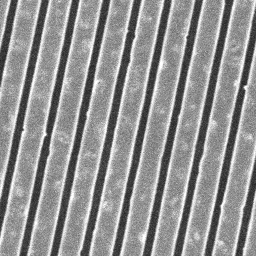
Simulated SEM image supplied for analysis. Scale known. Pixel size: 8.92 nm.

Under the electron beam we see parallel lines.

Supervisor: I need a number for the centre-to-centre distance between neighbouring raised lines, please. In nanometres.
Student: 269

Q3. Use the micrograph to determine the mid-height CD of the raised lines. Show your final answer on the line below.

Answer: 21.3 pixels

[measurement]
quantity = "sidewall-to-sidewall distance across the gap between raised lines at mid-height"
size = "77.6 nanometers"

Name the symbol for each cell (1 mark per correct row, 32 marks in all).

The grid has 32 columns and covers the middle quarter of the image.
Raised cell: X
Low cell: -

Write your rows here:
-XXXXX--XXXXXX--XXXXX---XXXXX--X
XXXXXX--XXXXXX--XXXXX---XXXXX--X
XXXXXX--XXXXX---XXXXX--XXXXXX--X
XXXXX---XXXXX--XXXXXX--XXXXXX--X
XXXXX---XXXXX--XXXXXX--XXXXX---X
XXXXX--XXXXXX--XXXXXX--XXXXX--XX
XXXXX--XXXXXX--XXXXX---XXXXX--XX
XXXXX--XXXXX---XXXXX---XXXXX--XX
XXXX---XXXXX--XXXXXX--XXXXXX--XX
XXXX---XXXXX--XXXXXX--XXXXX---XX
XXXX--XXXXXX--XXXXXX--XXXXX---XX
XXXX--XXXXX---XXXXX--XXXXXX--XXX
XXXX--XXXXX---XXXXX--XXXXXX--XXX
XXX---XXXXX--XXXXXX--XXXXXX--XXX
XXX---XXXXX--XXXXXX--XXXXX---XXX
XXX--XXXXXX--XXXXXX--XXXXX--XXXX
XXX--XXXXXX--XXXXX--XXXXXX--XXXX
XXX--XXXXX---XXXXX--XXXXXX--XXXX
XXX-XXXXXX--XXXXXX--XXXXXX--XXXX
XX--XXXXXX--XXXXX---XXXXX--XXXXX
XX--XXXXXX--XXXXX---XXXXX--XXXXX
XX--XXXXX---XXXXX---XXXXX--XXXXX
XX--XXXXX---XXXXX--XXXXXX--XXXXX
X---XXXXX---XXXXX--XXXXX---XXXXX
X--XXXXXX--XXXXXX--XXXXX--XXXXXX
X--XXXXXX--XXXXXX--XXXXX--XXXXXX
X--XXXXX---XXXXX---XXXXX--XXXXXX
X--XXXXX---XXXXX--XXXXXX--XXXXX-
---XXXXX--XXXXXX--XXXXXX--XXXXX-
--XXXXXX--XXXXXX--XXXXX---XXXXX-
--XXXXXX--XXXXX---XXXXX--XXXXXX-
--XXXXX---XXXXX--XXXXXX--XXXXXX-